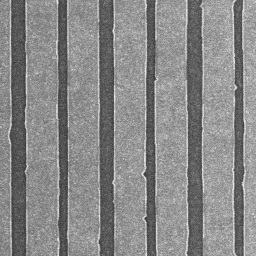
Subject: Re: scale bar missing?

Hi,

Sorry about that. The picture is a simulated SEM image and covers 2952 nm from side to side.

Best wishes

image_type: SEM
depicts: parallel lines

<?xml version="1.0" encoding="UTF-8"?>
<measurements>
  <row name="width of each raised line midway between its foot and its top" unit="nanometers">370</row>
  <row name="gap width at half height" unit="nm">152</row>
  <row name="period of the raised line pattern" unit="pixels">44.1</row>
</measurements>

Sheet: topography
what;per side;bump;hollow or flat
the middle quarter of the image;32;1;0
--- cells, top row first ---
01111111100001111111000111111110
01111111100001111111000111111110
01111111100001111111000111111110
01111111100001111111000111111110
01111111100001111111000111111110
01111111100001111111000111111110
01111111100001111111000111111110
01111111100001111111000111111110
01111111100001111111000111111110
01111111100001111111000111111110
01111111100001111111000111111110
01111111100001111111000111111110
01111111100001111111000111111110
01111111100001111111000111111110
01111111100001111111000111111110
01111111100001111111000111111110
01111111100001111111000111111110
01111111100001111111000111111110
01111111100001111111000111111110
01111111100001111111000111111110
01111111100001111111000111111110
01111111100001111111000111111110
01111111100001111111000111111110
01111111100001111111000111111110
01111111100001111111000111111110
01111111100001111111000111111110
01111111100001111111000111111110
01111111100001111111000111111110
01111111100001111111000111111110
01111111100011111111000111111110
01111111100011111111000111111110
01111111100001111111000111111110